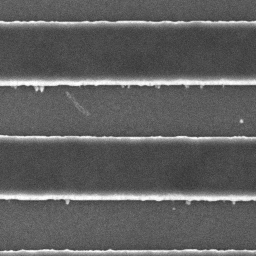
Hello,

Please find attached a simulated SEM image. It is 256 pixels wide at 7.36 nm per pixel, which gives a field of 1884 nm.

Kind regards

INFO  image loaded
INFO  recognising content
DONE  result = lines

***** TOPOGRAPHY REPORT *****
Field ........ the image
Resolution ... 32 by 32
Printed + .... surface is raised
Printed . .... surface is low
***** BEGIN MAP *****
................................
................................
................................
++++++++++++++++++++++++++++++++
++++++++++++++++++++++++++++++++
++++++++++++++++++++++++++++++++
++++++++++++++++++++++++++++++++
++++++++++++++++++++++++++++++++
++++++++++++++++++++++++++++++++
++++++++++++++++++++++++++++++++
++++++++++++++++++++++.++++.++++
................................
................................
................................
................................
................................
................................
++++++++++++++++++++++++++++++++
++++++++++++++++++++++++++++++++
++++++++++++++++++++++++++++++++
++++++++++++++++++++++++++++++++
++++++++++++++++++++++++++++++++
++++++++++++++++++++++++++++++++
++++++++++++++++++++++++++++++++
++++++++++++++++++++++++++++++++
................................
................................
................................
................................
................................
................................
++++++++++++++++++++++++++++++++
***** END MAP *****